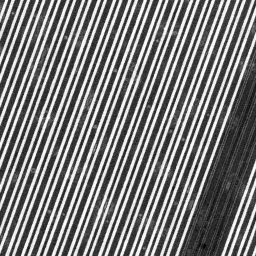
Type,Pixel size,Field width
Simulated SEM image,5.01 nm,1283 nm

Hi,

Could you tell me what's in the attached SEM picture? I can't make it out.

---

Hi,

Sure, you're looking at parallel lines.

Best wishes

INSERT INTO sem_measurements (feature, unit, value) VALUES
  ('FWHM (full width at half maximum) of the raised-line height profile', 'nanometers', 11.2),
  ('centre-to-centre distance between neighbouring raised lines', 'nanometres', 36.3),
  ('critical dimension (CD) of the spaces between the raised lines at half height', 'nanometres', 20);